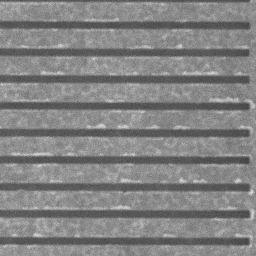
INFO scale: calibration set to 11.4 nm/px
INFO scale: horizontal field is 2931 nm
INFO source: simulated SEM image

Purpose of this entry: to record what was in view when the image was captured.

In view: parallel lines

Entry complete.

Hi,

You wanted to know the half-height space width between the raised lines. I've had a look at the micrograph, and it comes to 97.3 nm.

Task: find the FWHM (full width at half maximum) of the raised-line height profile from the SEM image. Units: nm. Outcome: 218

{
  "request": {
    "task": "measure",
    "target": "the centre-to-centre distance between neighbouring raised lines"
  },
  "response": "308 nm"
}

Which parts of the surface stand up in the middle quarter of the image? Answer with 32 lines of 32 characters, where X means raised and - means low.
XXXXXXXXXXXXXXXXXXXXXXXXXXXXXXXX
XXXXXXXXXXXXXXXXXXXXXXXXXXXXXXXX
XXXXXXXXXXXXXXXXXXXXXXXXXXXXXXXX
--------------------------------
--------------------------------
XXXXXXXXXXXXXXXXXXXXXXXXXXXXXXXX
XXXXXXXXXXXXXXXXXXXXXXXXXXXXXXXX
XXXXXXXXXXXXXXXXXXXXXXXXXXXXXXXX
XXXXXXXXXXXXXXXXXXXXXXXXXXXXXXXX
---XXXXXXXXXXXXXX-XXXXXXXXXXX--X
--------------------------------
--------------------------------
XXXXXXXXXXXXXXXXXXXXXXXXXXXXXXXX
XXXXXXXXXXXXXXXXXXXXXXXXXXXXXXXX
XXXXXXXXXXXXXXXXXXXXXXXXXXXXXXXX
XXXXXXXXXXXXXXXXXXXXXXXXXXXXXXXX
--------------------------------
--------------------------------
XXXXXXXXXXXXXXXXXXXXXXXXXXXXXXXX
XXXXXXXXXXXXXXXXXXXXXXXXXXXXXXXX
XXXXXXXXXXXXXXXXXXXXXXXXXXXXXXXX
XXXXXXXXXXXXXXXXXXXXXXXXXXXXXXXX
XXXXXXXXXXXXXXXXXXXXXXXXXXXXXXXX
--------------------------------
--------------------------------
XXXXXXXXXXXXXXXXXXXXXXXXXXXXXXXX
XXXXXXXXXXXXXXXXXXXXXXXXXXXXXXXX
XXXXXXXXXXXXXXXXXXXXXXXXXXXXXXXX
XXXXXXXXXXXXXXXXXXXXXXXXXXXXXXXX
XXXXXXXXXXXXXXXXXXXXXXXXXXXXXXXX
--------------------------------
--------------------------------